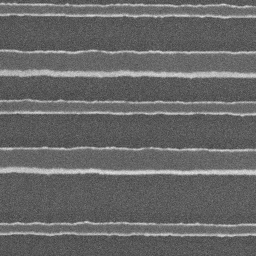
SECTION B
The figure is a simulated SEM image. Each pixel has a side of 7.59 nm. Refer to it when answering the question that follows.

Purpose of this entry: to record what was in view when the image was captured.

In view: lines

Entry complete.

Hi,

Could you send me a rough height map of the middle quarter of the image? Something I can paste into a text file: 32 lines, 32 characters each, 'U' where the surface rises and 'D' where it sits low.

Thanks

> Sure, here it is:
UUUUUUUUUUUUUUUUUUUUUUUUUUUUUUUU
UUUUUUUUUUUUUUUUUUUUUUUUUUUUUUUU
UUUDDDDDUUUDDDDDDUDDDDUUUUUUUUUU
DDDDDDDDDDDDDDDDDDDDDDDDDDDDDDDD
DDDDDDDDDDDDDDDDDDDDDDDDDDDDDDDD
DDDDDDDDDDDDDDDDDDDDDDDDDDDDDDDD
DDDDDDDDDDDDDDDDDDDDDDDDDDDDDDDD
DDDDDDDDDDDDDDDDDDDDDDDDDDDDDDDD
DDDDDDDDDDDDDDDDDDDDDDDDDDDDDDDD
UUUUUUDUUUUUUUUDDDDDDDDUUDDDUDDD
UUUUUUUUUUUUUUUUUUUUUUUUUUUUUUUU
UUUUUUUUUUUUUUUUUUUUUUUUUUUUUUUU
DDDDDDDDDDDDDDDDDDDDDDDDDDDDDDDD
DDDDDDDDDDDDDDDDDDDDDDDDDDDDDDDD
DDDDDDDDDDDDDDDDDDDDDDDDDDDDDDDD
DDDDDDDDDDDDDDDDDDDDDDDDDDDDDDDD
DDDDDDDDDDDDDDDDDDDDDDDDDDDDDDDD
DDDDDDDDDDDDDDDDDDDDDDDDDDDDDDDD
DDDDDDDDDDDDDDDDDDDDDDDDDDDDDDDD
DDDDDDDDDDDDDDDDDDDDDDDDDDDDDDDD
DDDDDDDDDDDDDDDDDDDDDDDDDDDDDDDD
UUUUUUUUUUUUUUUUUUUUUUUUUUUUUUUU
UUUUUUUUUUUUUUUUUUUUUUUUUUUUUUUU
UUUUUUUUUUUUUUUUUUUUUUUUUUUUUUUU
UUUUUUUUUUUUUUUUUUUUUUUUUUUUUUUU
UUUUUUUUUUUUUUUUUUUUUUUUUUUUUUUU
UUUUUUUUUUUUUUUUUUUUUUUUUUUUUUUU
DDDDDDDDDDDDDDDDDDDDDDDDDDDDDDDD
DDDDDDDDDDDDDDDDDDDDDDDDDDDDDDDD
DDDDDDDDDDDDDDDDDDDDDDDDDDDDDDDD
DDDDDDDDDDDDDDDDDDDDDDDDDDDDDDDD
DDDDDDDDDDDDDDDDDDDDDDDDDDDDDDDD